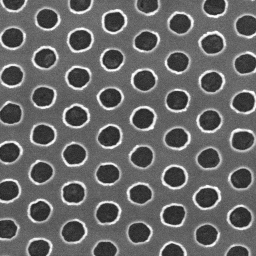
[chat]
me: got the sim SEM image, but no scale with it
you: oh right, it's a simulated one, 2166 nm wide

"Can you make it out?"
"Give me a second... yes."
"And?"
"a regular array of holes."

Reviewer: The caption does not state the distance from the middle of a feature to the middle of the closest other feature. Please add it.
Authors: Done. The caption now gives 319 nanometers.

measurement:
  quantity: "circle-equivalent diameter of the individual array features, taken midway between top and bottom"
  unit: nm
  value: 180